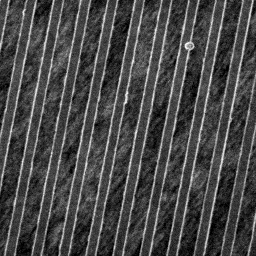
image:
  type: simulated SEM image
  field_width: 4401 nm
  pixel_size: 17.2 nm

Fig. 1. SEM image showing parallel lines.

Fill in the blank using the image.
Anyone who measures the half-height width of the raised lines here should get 167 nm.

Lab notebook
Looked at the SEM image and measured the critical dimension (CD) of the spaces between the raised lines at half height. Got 287 nm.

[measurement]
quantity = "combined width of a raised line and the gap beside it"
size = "457 nanometres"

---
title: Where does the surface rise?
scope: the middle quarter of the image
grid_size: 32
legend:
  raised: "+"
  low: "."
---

.+++....++.....++....+++....+++.
.++.....++.....++....+++....++..
.++....+++....+++....++.....++..
+++....+++....++.....++....+++..
+++....++.....++....+++....+++..
++.....++.....++....+++....+++..
++.....++.....++....+++....++...
++....+++....+++....++.....++...
++....+++....++.....++.....++...
++....++.....++.....++....+++...
+.....++.....++....+++....+++...
+.....++.....++....+++....++....
+....+++....+++....+++....++....
+....+++....++.....++.....++....
+....+++....++.....++....+++....
+....++.....++....+++....+++....
+....++.....++....+++....++.....
....+++....+++....+++....++.....
....+++....+++....++.....++....+
....+++....++.....++.....++....+
....++.....++....+++....+++....+
....++.....++....+++....+++....+
....++....+++....+++....++.....+
...+++....++.....++.....++.....+
...+++....++.....++....+++....++
...+++....++....+++....+++....++
...++.....++....+++....+++....++
...++....+++....+++....++.....++
..+++....+++....++.....++.....++
..+++....++.....++.....++....+++
..++.....++....+++....+++....+++
..++.....++....+++....+++....++.